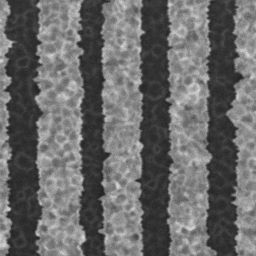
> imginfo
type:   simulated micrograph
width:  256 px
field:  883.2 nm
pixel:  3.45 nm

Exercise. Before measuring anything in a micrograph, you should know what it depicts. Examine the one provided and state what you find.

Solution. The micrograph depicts one or a few lines or trenches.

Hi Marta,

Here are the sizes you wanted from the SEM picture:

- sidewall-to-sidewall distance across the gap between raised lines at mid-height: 98.8 nanometers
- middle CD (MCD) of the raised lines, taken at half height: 125 nanometres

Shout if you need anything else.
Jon